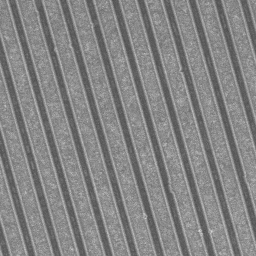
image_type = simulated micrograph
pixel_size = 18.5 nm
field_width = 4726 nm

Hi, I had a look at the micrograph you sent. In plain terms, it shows parallel lines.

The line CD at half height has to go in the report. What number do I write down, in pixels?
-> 16.5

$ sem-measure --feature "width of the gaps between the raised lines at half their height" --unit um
0.151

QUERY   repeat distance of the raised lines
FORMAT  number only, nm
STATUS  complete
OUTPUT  457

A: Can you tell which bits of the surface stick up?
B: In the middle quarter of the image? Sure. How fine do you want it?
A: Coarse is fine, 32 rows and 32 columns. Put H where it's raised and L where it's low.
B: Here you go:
HHHLLLHHHHLLHHHHLLHHHHHLLHHHHLLH
HHHHLLHHHHLLHHHHHLLHHHHLLHHHHLLL
HHHHLLHHHHLLHHHHHLLHHHHLLHHHHHLL
HHHHLLHHHHHLLHHHHLLHHHHHLLHHHHLL
HHHHLLLHHHHLLHHHHLLHHHHHLLHHHHLL
HHHHHLLHHHHLLHHHHHLLHHHHLLHHHHHL
LHHHHLLHHHHLLLHHHHLLHHHHLLHHHHHL
LHHHHLLHHHHHLLHHHHLLHHHHHLLHHHHL
LHHHHHLLHHHHLLHHHHHLLHHHHLLHHHHL
LLHHHHLLHHHHLLHHHHHLLHHHHLLHHHHH
LLHHHHLLHHHHHLLHHHHLLHHHHHLLHHHH
LLHHHHLLLHHHHLLHHHHLLHHHHHLLHHHH
LLHHHHHLLHHHHLLHHHHHLLHHHHLLHHHH
HLLHHHHLLHHHHLLLHHHHLLHHHHLLHHHH
HLLHHHHLLHHHHHLLHHHHLLHHHHHLLHHH
HLLHHHHHLLHHHHLLHHHHHLHHHHHLLHHH
HLLLHHHHLLHHHHLLHHHHHLLHHHHLLHHH
HHLLHHHHLLHHHHLLLHHHHLLHHHHHLHHH
HHLLHHHHLLLHHHHLLHHHHLLHHHHHLLHH
HHLLHHHHHLLHHHHLLHHHHHLLHHHHLLHH
HHLLLHHHHLLHHHHLLHHHHHLLHHHHLLHH
HHHLLHHHHLLHHHHHLLHHHHLLHHHHHLLH
HHHLLHHHHLLLHHHHLLHHHHHLLHHHHLLH
HHHLLLHHHHLLHHHHLLHHHHHLLHHHHLLH
HHHHLLHHHHLLHHHHLLLHHHHLLHHHHLLH
HHHHLLHHHHLLHHHHHLLHHHHLLHHHHHLL
HHHHLLHHHHHLLHHHHLLHHHHHLLHHHHLL
HHHHLLLHHHHLLHHHHLLHHHHHLLHHHHLL
HHHHHLLHHHHLLHHHHHLLHHHHLLHHHHHL
LHHHHLLHHHHLLLHHHHLLHHHHLLHHHHHL
LHHHHLLHHHHHLLHHHHLLHHHHHLHHHHHL
LHHHHHLLHHHHLLHHHHHLLHHHHLHHHHHL